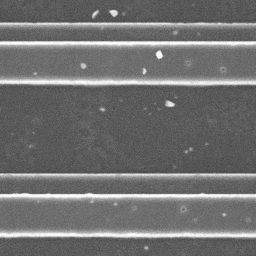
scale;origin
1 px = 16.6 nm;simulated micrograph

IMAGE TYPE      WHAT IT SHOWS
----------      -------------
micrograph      lines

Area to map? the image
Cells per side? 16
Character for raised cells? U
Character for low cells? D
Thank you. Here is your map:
DDDDDDDDDDDDDDDD
UDDDDDDDDDDDDDDD
UUUUUUUUUUUUUUUU
UUUUUUUUUUUUUUUU
UUUUUUUUUUUUUUUU
DDDDDDDDDDDDDDDD
DDDDDDDDDDDDDDDD
DDDDDDDDDDDDDDDD
DDDDDDDDDDDDDDDD
DDDDDDDDDDDDDDDD
DDDDDDDDDDDDDDDD
UUUUUUUUUUUUUUUU
UUUUUUUUUUUUUUUU
UUUUUUUUUUUUUUUU
UUUUUUUUUUUUUUUU
DDDDDDDDDDDDDDDD